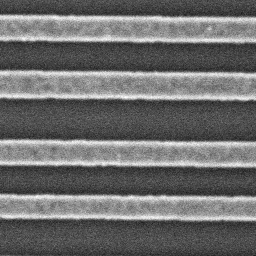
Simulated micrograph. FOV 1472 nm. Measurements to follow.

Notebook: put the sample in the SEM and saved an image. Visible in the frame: lines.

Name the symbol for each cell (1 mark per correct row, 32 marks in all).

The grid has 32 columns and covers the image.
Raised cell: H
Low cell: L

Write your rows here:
LLLLLLLLLLLLLLLLLLLLLLLLLLLLLLLL
LLLLLLLLLLLLLLLLLLLLLLLLLLLLLLLL
HHHHHHHHHHHHHHHHHHHHHHHHHHHHHHHH
HHHHHHHHHHHHHHHHHHHHHHHHHHHHHHHH
HHHHHHHHHHHHHHHHHHHHHHHHHHHHHHHH
LLLLLLLLLLLLLLLLLLLLLLLLLLLLLLLL
LLLLLLLLLLLLLLLLLLLLLLLLLLLLLLLL
LLLLLLLLLLLLLLLLLLLLLLLLLLLLLLLL
LLLLLLLLLLLLLLLLLLLLLLLLLLLLLLLL
HHHHHHHHHHHHHHHHHHHHHHHHHHHHHHHH
HHHHHHHHHHHHHHHHHHHHHHHHHHHHHHHH
HHHHHHHHHHHHHHHHHHHHHHHHHHHHHHHH
LLLLLLLLLLLLLLLLLLLLLLLLLLLLLLLL
LLLLLLLLLLLLLLLLLLLLLLLLLLLLLLLL
LLLLLLLLLLLLLLLLLLLLLLLLLLLLLLLL
LLLLLLLLLLLLLLLLLLLLLLLLLLLLLLLL
LLLLLLLLLLLLLLLLLLLLLLLLLLLLLLLL
LLLLLLLLLLLLLLLLLLLLLLLLLLLLLLLL
HHHHHHHHHHHHHHHHHHHHHHHHHHHHHHHH
HHHHHHHHHHHHHHHHHHHHHHHHHHHHHHHH
HHHHHHHHHHHHHHHHHHHHHHHHHHHHHHHH
LLLLLLLLLLLLLLLLLLLLLLLLLLLLLLLL
LLLLLLLLLLLLLLLLLLLLLLLLLLLLLLLL
LLLLLLLLLLLLLLLLLLLLLLLLLLLLLLLL
HHLLHHHLLLLLLLLLLLLLLLLLLLLLLLLL
HHHHHHHHHHHHHHHHHHHHHHHHHHHHHHHH
HHHHHHHHHHHHHHHHHHHHHHHHHHHHHHHH
LLLLLLLLLLLLLLLLLLLLLLLLLLLLLLLL
LLLLLLLLLLLLLLLLLLLLLLLLLLLLLLLL
LLLLLLLLLLLLLLLLLLLLLLLLLLLLLLLL
LLLLLLLLLLLLLLLLLLLLLLLLLLLLLLLL
LLLLLLLLLLLLLLLLLLLLLLLLLLLLLLLL